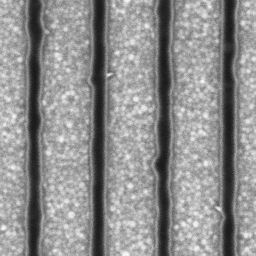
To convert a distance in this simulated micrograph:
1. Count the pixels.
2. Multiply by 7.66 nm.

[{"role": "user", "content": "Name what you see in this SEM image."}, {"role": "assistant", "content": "one or a few lines or trenches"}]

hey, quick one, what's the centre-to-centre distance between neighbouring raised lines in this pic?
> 0.497 micrometres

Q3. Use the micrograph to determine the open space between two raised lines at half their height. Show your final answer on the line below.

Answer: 376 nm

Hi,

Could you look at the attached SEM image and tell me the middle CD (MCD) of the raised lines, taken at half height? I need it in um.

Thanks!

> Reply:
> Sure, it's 0.12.